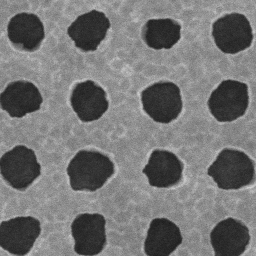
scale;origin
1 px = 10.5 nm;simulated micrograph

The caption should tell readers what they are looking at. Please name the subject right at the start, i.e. a regular array of holes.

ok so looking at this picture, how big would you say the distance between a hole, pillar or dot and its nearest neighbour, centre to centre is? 712 nm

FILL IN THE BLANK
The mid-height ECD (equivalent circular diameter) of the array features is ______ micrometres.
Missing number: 0.416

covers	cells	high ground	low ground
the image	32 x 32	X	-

XXXXXXXXXXXXXXXXXXXXXXXXXXXXXXXX
XXXXXXXXXXX--XXXXXXXXXXXXXXXXXXX
X----XXXX-----XXXXX--XXXXXX----X
X----XXXX-----XXXX-----XXXX----X
X----XXXX----XXXXX-----XXXX-----
XX---XXXX---XXXXXX----XXXXX----X
XXXXXXXXXXXXXXXXXXXXXXXXXXXX--XX
XXXXXXXXXXXXXXXXXXXXXXXXXXXXXXXX
XXXXXXXXXXXXXXXXXXXXXXXXXXXXXXXX
XXXXXXXXXXXXXXXXXXXXXXXXXXXXXXXX
X---XXXXXX--XXXXXXX---XXXXX----X
-----XXXX----XXXXX----XXXXX----X
-----XXXX----XXXXX-----XXX-----X
-----XXXX----XXXXX-----XXX-----X
X--XXXXXXX---XXXXXX---XXXXX---XX
XXXXXXXXXXXXXXXXXXXXXXXXXXXXXXXX
XXXXXXXXXXXXXXXXXXXXXXXXXXXXXXXX
XXXXXXXXXXXXXXXXXXXXXXXXXXXXXXXX
XX--XXXXXXXXXXXXXXXXXXXXXXXXXXXX
----XXXXX----XXXXXX---XXXXX----X
-----XXXX-----XXXX-----XXX------
-----XXX------XXXX-----XXX------
X---XXXXX----XXXXXX---XXXXX-----
XX-XXXXXX---XXXXXXXX-XXXXXXX--XX
XXXXXXXXXXXXXXXXXXXXXXXXXXXXXXXX
XXXXXXXXXXXXXXXXXXXXXXXXXXXXXXXX
XXXXXXXXXXXXXXXXXXXXXXXXXXXXXXXX
X----XXXX----XXXXXX--XXXXXXX--XX
-----XXXX----XXXXXX---XXXXX----X
-----XXXX----XXXXX-----XXX-----X
----XXXXX----XXXXX----XXXX-----X
X--XXXXXXX--XXXXXX----XXXXX---XX